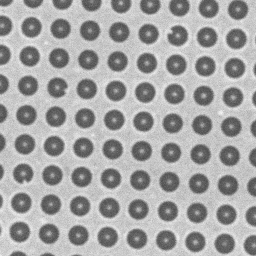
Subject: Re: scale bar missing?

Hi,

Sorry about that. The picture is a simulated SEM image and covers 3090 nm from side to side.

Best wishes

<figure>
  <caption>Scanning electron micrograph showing an array of small figures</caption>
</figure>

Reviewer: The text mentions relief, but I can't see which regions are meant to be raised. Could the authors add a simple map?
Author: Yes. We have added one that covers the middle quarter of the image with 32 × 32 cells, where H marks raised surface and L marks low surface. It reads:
LHHHLLLLHHHLLLLLHHLLLLLLHLLLLLLH
HHHHHLLHHHHHLLLHHHHLLLLHHHLLLLLH
HHHHHHHHHHHHHHHHHHHHLLHHHHLLLLHH
HHHHHHHHHHHHHHHHHHHHHHHHHHHHHHHH
LHHHLLLLHHHLLLLHHHHLLLHHHHHHHHHH
LHHLLLLLHHLLLLLLHHLLLLLHHHLLLHHH
LHHLLLLLLHLLLLLLHHLLLLLHHLLLLLHH
HHHLLLLLHHLLLLLLHLLLLLLHHLLLLLHH
HHHHLLLHHHHLLLLHHHLLLLLHHLLLLLHH
HHHHHHHHHHHHLLHHHHHLLLHHHHLLLLHH
HHHHHHHHHHHHHHHHHHHHHHHHHHHHHHHH
HHHHLLLHHHHLLLHHHHHHHHHHHHHHHHHH
LHHLLLLLHHLLLLLHHHLLLLHHHHLLHHHH
LHHLLLLLHHLLLLLHHLLLLLLHHLLLLHHH
HHHLLLLLHHLLLLLHHLLLLLLHHLLLLLHH
HHHLLLLHHHLLLLLHHLLLLLHHHLLLLLHH
HHHHHHHHHHHLLLHHHHLLLLHHHLLLLHHH
HHHHHHHHHHHHHHHHHHHHHHHHHHHHHHHH
HHHLLLHHHHHHHHHHHHHHHHHHHHHHHHHH
HHLLLLLHHHLLLLHHHHLLLHHHHHHHHHHH
HHLLLLLHHHLLLLLHHLLLLLHHHLLLLHHH
HHLLLLLLHLLLLLLHHLLLLLHHLLLLLHHH
HHHLLLLHHHLLLLLHHLLLLLHHLLLLLHHL
HHHHLLHHHHHLLLHHHLLLLHHHLLLLLHHH
HHHHHHHHHHHHHHHHHHHHHHHHHLLLHHHH
HHHHLHHHHHHHHHHHHHHHHHHHHHHHHHHH
HHLLLLLHHHLLLHHHHHLLHHHHHHHHHHHH
HHLLLLLHHLLLLLHHHLLLLHHHHLLLHHHH
HHLLHLLHHLLHLLHHLLLLLLHHLLLLLHHL
HHLLLLLHHLLLLLHHLLLLLLHHLLLLLHHL
HHHLLLHHHHLLLLHHHLLLLHHHLLLLLHHL
HHHHHHHHHHHHHHHHHHLLHHHHHLLLHHHH